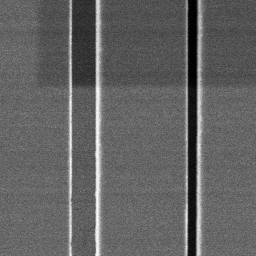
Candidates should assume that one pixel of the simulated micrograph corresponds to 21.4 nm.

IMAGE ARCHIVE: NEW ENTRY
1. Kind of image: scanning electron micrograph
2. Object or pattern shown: lines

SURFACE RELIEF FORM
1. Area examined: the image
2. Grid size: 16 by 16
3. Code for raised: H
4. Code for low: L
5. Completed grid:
HHHHLLHHHHHHHHHH
HHHHLLHHHHHHHHHH
HHHHLLHHHHHHHHHH
HHHHLLHHHHHHHHHH
HHHHLLHHHHHHHHHH
HHHHLLHHHHHHHHHH
HHHHLLHHHHHHHHHH
HHHHLLHHHHHHHHHH
HHHHLLHHHHHHHHHH
HHHHLLHHHHHHHHHH
HHHHLLHHHHHHHHHH
HHHHLLHHHHHHHHHH
HHHHLLHHHHHHHHHH
HHHHLLHHHHHHHHHH
HHHHLLHHHHHHHHHH
HHHHLLHHHHHHHHHH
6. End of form